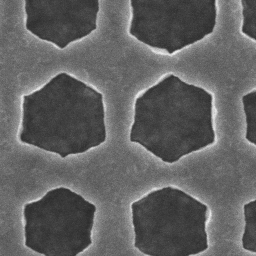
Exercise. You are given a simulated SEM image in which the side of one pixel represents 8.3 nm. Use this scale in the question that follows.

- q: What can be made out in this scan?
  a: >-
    holes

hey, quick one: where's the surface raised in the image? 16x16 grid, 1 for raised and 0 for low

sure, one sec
1100001100000010
1100001100000110
1110011110001111
1111111111111111
1111111111111111
1110001110000111
1000001100000110
1000000100000110
1000000100000110
1110011110001111
1111111111111111
1111111111111111
1100011110001111
1000001100000110
1100001100000110
1100011110000110